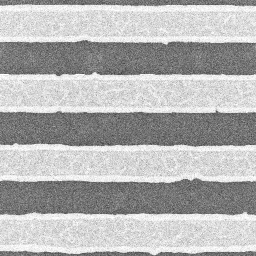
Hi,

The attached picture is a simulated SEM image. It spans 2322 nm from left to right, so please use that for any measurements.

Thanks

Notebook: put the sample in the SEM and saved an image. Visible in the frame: one or a few lines or trenches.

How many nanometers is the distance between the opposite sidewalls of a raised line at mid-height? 296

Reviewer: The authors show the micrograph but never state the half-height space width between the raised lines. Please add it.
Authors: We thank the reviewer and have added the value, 0.336 microns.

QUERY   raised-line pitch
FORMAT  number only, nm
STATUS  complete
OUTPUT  633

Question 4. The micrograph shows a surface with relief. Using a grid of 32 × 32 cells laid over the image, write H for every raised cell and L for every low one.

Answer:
LLLLLLLLLLLLLLLLLLLLLLLLLLLLLLLL
HHHHHHHHHHHHHHHHHHHHHHHHHHHHHHHH
HHHHHHHHHHHHHHHHHHHHHHHHHHHHHHHH
HHHHHHHHHHHHHHHHHHHHHHHHHHHHHHHH
HHHHHHHHHHHHHHHHHHHHHHHHHHHHHHHH
LLLLLLLLLLLLLLLLLLLLLLLLLLLLLLLL
LLLLLLLLLLLLLLLLLLLLLLLLLLLLLLLL
LLLLLLLLLLLLLLLLLLLLLLLLLLLLLLLL
LLLLLLLLLLLLLLLLLLLLLLLLLLLLLLLL
LLLLLLLLLLLLLLLLLLLLLLLLLLLLLLLL
HHHHHHHHHHHHHHHHHHHHHHHHHHHHHHHH
HHHHHHHHHHHHHHHHHHHHHHHHHHHHHHHH
HHHHHHHHHHHHHHHHHHHHHHHHHHHHHHHH
HHHHHHHHHHHHHHHHHHHHHHHHHHHHHHHH
LLLLLLLLLLLLLLLLLLLLLLLLLLLLLLLL
LLLLLLLLLLLLLLLLLLLLLLLLLLLLLLLL
LLLLLLLLLLLLLLLLLLLLLLLLLLLLLLLL
LLLLLLLLLLLLLLLLLLLLLLLLLLLLLLLL
LHHHHHHHHLLLLLLLHHHLLHHLLLLHHHHH
HHHHHHHHHHHHHHHHHHHHHHHHHHHHHHHH
HHHHHHHHHHHHHHHHHHHHHHHHHHHHHHHH
HHHHHHHHHHHHHHHHHHHHHHHHHHHHHHHH
LLLLLLLLLLLLLLLLLLLLLHLLLLLLLLLL
LLLLLLLLLLLLLLLLLLLLLLLLLLLLLLLL
LLLLLLLLLLLLLLLLLLLLLLLLLLLLLLLL
LLLLLLLLLLLLLLLLLLLLLLLLLLLLLLLL
LLLLLLLLLLLLLLLLLLLLLLLLLLLLLLLL
HHHHHHHHHHHHHHHHHHHHHHHHHHHHHHHH
HHHHHHHHHHHHHHHHHHHHHHHHHHHHHHHH
HHHHHHHHHHHHHHHHHHHHHHHHHHHHHHHH
HHHHHHHHHHHHHHHHHHHHHHHHHHHHHHHH
LLLLLLLLLLLLLLLLLLLLLLLLLLLLLLLL